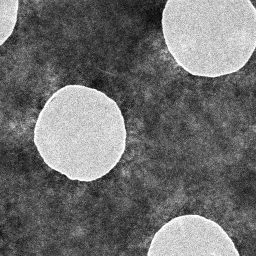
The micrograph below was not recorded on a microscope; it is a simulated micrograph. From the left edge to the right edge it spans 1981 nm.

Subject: raised bodies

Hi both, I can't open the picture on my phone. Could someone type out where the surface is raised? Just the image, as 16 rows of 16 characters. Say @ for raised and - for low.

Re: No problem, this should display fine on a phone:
@---------@@@@@@
@---------@@@@@@
----------@@@@@@
-----------@@@@@
------------@@@-
----@@----------
---@@@@---------
--@@@@@@--------
--@@@@@@--------
--@@@@@@--------
---@@@@---------
----------------
----------------
----------------
----------@@@@--
---------@@@@@@-